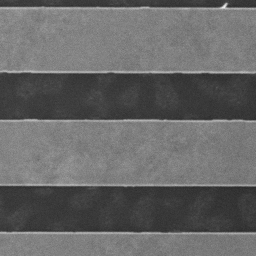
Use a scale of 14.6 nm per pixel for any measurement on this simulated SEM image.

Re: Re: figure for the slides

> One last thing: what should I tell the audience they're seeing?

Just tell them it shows one or a few lines or trenches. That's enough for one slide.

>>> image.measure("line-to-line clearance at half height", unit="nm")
697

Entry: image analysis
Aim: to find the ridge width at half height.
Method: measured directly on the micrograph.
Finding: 0.947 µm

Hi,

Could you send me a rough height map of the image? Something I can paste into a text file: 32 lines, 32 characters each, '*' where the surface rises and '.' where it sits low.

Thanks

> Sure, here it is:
................................
********************************
********************************
********************************
********************************
********************************
********************************
********************************
********************************
................................
................................
................................
................................
................................
................................
********************************
********************************
********************************
********************************
********************************
********************************
********************************
********************************
................................
................................
................................
................................
................................
................................
********************************
********************************
********************************